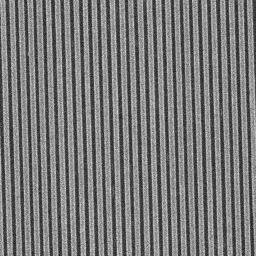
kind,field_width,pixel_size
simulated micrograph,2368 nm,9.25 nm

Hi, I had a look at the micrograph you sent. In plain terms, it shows parallel lines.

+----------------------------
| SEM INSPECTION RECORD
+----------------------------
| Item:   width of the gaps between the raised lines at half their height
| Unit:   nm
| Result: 39.3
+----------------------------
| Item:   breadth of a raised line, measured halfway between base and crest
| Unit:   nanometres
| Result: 46.2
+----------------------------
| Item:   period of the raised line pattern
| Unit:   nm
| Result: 84.5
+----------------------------